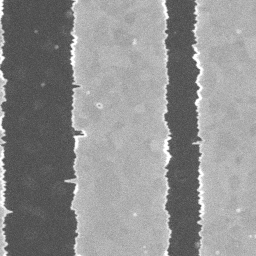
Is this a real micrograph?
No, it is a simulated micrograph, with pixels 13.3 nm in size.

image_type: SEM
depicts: one or a few lines or trenches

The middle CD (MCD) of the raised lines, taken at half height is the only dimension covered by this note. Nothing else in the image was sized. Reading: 1230 nm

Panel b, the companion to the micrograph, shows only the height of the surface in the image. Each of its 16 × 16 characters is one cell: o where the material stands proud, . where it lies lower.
.....ooooo..oooo
.....ooooo..oooo
.....ooooo..oooo
.....ooooo..oooo
.....ooooo..oooo
.....ooooo..oooo
.....ooooo..oooo
.....ooooo..oooo
.....oooooo.oooo
.....oooooo..ooo
.....ooooo..oooo
.....ooooo..oooo
.....ooooo...ooo
.....ooooo...ooo
.....oooooo..ooo
.....ooooo..oooo